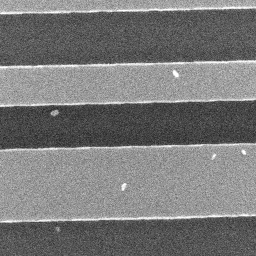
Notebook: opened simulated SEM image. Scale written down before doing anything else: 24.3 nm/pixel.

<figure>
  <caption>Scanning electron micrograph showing lines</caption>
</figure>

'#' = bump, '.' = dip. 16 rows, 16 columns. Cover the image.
###############.
................
................
................
################
################
#####...........
................
................
################
################
################
################
##############..
................
................